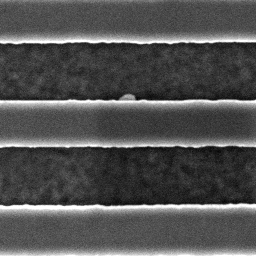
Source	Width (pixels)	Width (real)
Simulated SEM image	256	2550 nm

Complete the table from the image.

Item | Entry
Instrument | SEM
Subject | lines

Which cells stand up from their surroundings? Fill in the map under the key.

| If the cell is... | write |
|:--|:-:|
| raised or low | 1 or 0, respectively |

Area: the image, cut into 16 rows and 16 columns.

1111111111111111
1111111111111111
1111111111111111
0000000000000000
0000000000000000
0000000000000000
1111111111111111
1111111111111111
1111111111111111
0000000000000000
0000000000000000
0000000000000000
0000000000000000
1111111111111111
1111111111111111
1111111111111111